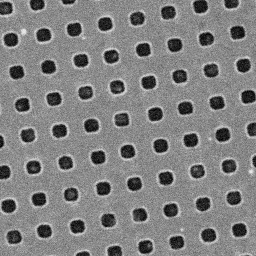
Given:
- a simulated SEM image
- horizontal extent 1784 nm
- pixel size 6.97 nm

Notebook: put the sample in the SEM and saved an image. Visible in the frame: a regular array of holes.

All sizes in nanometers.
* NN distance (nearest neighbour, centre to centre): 219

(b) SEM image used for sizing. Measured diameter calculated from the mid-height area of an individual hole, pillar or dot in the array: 110 nanometers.